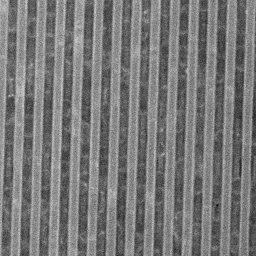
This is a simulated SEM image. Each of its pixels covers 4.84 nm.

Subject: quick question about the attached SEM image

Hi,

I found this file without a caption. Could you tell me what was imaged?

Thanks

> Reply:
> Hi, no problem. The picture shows parallel lines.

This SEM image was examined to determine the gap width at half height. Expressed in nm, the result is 49.6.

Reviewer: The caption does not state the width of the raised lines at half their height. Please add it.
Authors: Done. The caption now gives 0.0405 um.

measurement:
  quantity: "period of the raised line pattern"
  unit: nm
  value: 92.1